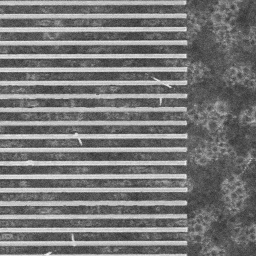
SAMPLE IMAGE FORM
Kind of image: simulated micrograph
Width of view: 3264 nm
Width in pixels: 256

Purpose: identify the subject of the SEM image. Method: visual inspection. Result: parallel lines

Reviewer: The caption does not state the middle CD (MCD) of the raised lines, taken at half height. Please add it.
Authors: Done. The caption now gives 43 nanometers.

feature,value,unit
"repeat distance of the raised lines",0.17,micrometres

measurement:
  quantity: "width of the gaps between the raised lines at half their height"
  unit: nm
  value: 129